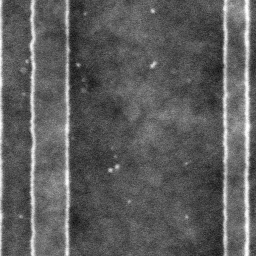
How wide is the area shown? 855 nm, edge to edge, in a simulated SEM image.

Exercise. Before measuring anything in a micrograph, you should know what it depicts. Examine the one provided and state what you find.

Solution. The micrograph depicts lines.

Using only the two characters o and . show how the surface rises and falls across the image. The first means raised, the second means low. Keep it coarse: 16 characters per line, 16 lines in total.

oooo..........oo
oooo..........oo
oooo..........oo
oooo..........oo
oooo..........oo
oooo..........oo
oooo..........oo
oooo..........oo
oooo..........oo
oooo..........oo
oooo..........oo
oooo..........oo
oooo..........oo
oooo..........oo
oooo..........oo
oooo..........oo